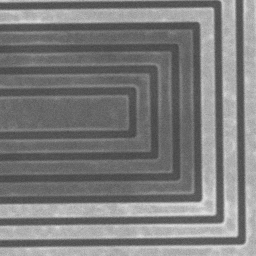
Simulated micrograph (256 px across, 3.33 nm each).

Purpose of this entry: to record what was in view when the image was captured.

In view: groups of lines, slits or small figures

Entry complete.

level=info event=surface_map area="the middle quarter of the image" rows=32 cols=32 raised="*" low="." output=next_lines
.......................****..***
........................***..***
........................**...***
*********************...**...***
*********************...**...***
*************....****...**...***
..................***...**...***
...................**...**...***
****************...**...***..***
****************...**...***..***
****************..***...***..***
****************..***...***..***
****************..***...***..***
****************..***...***..***
****************..***...***..***
****************..***...***..***
..................***...***..***
..................***...***..***
..................***...***..***
*********************...***..***
*********************...***..***
*********************...***..***
........................***..***
.......................****..***
***************************..***
***************************..***
***************************..***
.............................***
.............................***
............................****
********************************
********************************